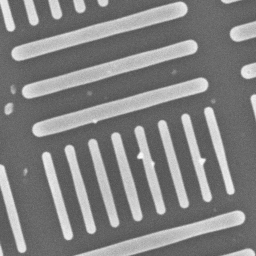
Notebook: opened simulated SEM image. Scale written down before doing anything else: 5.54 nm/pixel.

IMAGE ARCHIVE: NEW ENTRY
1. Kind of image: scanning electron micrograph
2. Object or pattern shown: groups of lines, slits or small figures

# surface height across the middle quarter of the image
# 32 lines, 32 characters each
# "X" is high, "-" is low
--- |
--------XXXXXXXXXXXXX-----------
-----XXXXXXXXXXXX---------------
-XXXXXXXXXXXX-------------------
XXXXXXXXXX----------------------
XXXXXXX-----------------------XX
XXX------------------------XXXXX
-----------------------XXXXXXXXX
-------------------XXXXXXXXXXXXX
---------------XXXXXXXXXXXXX----
------------XXXXXXXXXXXXX-------
--------XXXXXXXXXXXXXX----------
-----XXXXXXXXXXXXX--------------
-XXXXXXXXXXXXXX-----------------
XXXXXXXXXXX-------------------X-
XXXXXXXX----------------X-----XX
XXXX--------------------XX----XX
X-----------------XX----XX----XX
------------XX----XX----XX----XX
------------XX----XX----XXX----X
------XX----XX----XXX----XX----X
-X----XX-----XX----XX----XX----X
XX-----XX----XX----XX----XX-----
-XX----XX----XX----XX----XXX----
-XX----XX----XXX--XXXX----XX----
-XX----XXX---XXX----XX----XX----
-XXX----XX----XX----XX----XXX---
--XX----XX----XXX---XXX----XX---
--XX----XXX---XXX----XX----XX---
--XX----XXX---XXX----XX----XX---
--XXX----XX----XX----XXX---XXX--
---XX----XX----XXX---XXX----XX--
---XX----XXX---XXX----XX----XX--